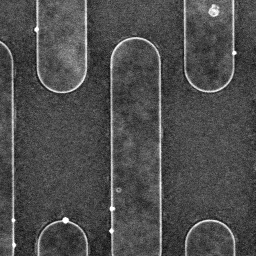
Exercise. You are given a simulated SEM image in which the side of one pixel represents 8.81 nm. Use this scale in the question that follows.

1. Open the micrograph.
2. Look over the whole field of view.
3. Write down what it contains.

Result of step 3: groups of lines, slits or small figures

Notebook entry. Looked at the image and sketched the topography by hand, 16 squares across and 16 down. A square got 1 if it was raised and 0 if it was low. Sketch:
0011100000001110
0011100000001110
0011100010001110
1011100111001110
1011100111001110
1001100111001100
1000000111000000
1000000111000000
1000000111000000
1000000111000000
1000000111000000
1000000111000000
1000000111000000
1000000111000000
1001100111001100
1011100111001110